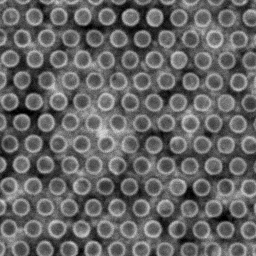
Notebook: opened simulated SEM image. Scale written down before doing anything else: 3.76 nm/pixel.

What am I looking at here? a regular array of raised bodies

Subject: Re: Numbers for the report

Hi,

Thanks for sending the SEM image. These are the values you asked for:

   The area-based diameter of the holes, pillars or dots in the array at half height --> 61.9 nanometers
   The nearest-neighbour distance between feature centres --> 89.6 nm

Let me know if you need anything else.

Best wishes